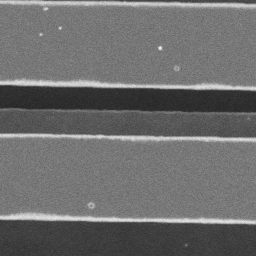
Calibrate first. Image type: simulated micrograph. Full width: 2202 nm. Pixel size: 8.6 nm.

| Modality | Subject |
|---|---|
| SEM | lines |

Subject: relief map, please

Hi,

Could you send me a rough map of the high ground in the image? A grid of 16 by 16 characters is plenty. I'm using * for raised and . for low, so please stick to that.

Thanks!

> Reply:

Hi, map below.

****************
****************
****************
****************
****************
.........*******
................
................
*******.........
****************
****************
****************
****************
****************
................
................